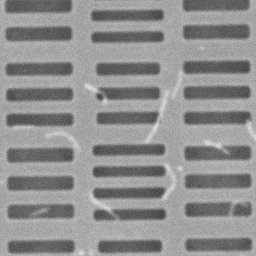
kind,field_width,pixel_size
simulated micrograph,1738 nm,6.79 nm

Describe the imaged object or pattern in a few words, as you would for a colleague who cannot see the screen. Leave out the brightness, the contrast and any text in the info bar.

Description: groups of lines, slits or small figures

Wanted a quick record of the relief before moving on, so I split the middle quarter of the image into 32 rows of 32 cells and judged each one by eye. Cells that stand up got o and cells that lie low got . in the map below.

..oooooo................ooooo...
..oooooo................oooooo..
..oooooo................oooooo..
oooooooooooooooooooooooooooooooo
oooooooooooooooooooooooooooooooo
oooooooooooooooooo.....ooooooo..
..oooooo................oooooo..
..oooooo................oooooo..
..oooooo................oooooo..
oooooooooooooooooooooooooooooooo
oooooooooooooooooooooooooooooooo
oooooooooooooooooooooooooooooooo
..oooooo................oooooo..
...ooooo................oooooo..
...ooooo................oooooo..
..oooooooooooooooooooooooooooooo
oooooooooooooooooooooooooooooooo
oooooooooooooooooooooooooooooooo
oooooooooooooooooooooooooooooooo
oooooooooooooooooooooooooooooooo
ooooooo..................oooooo.
..ooooo..................ooooo..
...oooo..................ooooo..
...ooooooooooooooooooooooooooo..
..ooooooooooooooooooooooooooooo.
oooooooo.................ooooooo
ooooooo..................ooooooo
ooooooo..................oooooo.
..oooooo.................ooooo..
...ooooooooooooooooooooooooooo..
...oooooooooooooooooo....ooooo..
..ooooo..................ooooooo